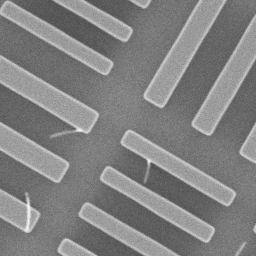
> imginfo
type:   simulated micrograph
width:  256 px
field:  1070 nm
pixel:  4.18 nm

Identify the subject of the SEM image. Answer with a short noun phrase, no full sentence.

groups of lines, slits or small figures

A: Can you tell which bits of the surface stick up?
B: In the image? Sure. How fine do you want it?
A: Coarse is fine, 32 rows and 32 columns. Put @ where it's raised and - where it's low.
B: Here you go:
-@-----@@@@------@@------@@@----
@@@------@@@@-----------@@@-----
-@@@@------@@@@---------@@@-----
---@@@@-----@@@@-------@@@-----@
-----@@@@-----@@------@@@@----@@
------@@@@------------@@@-----@@
--------@@@@---------@@@-----@@@
@---------@@@@-------@@@-----@@@
@@@---------@@------@@@-----@@@-
@@@@---------------@@@@----@@@@-
@@@@@@-------------@@@-----@@@--
--@@@@@@----------@@@@----@@@@--
----@@@@@@--------@@@-----@@@---
-----@@@@@@--------------@@@----
-------@@@@@------------@@@@----
---------@@@------------@@@-----
@@--------------@--------@-----@
@@@@-----------@@@@------------@
@@@@@-----------@@@@----------@@
-@@@@@@-----------@@@@--------@@
---@@@@@-----------@@@@@--------
-----@@@-----@@------@@@@-------
------@@-----@@@-------@@@@-----
--------------@@@@------@@@@@---
@---------------@@@@------@@@---
@@@---------------@@@@------@---
@@@@@-----@@@------@@@@---------
-@@@@------@@@@------@@@@-------
--@@--------@@@@@------@@@@-----
--------------@@@@------@@------
--------@@------@@@@------------
-------@@@@------@@@@@----------